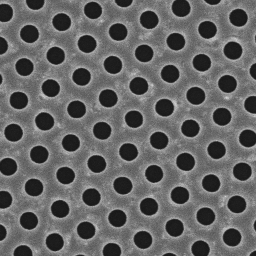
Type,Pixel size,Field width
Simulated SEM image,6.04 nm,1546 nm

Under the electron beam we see a regular array of holes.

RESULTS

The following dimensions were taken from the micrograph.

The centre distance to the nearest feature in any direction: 0.2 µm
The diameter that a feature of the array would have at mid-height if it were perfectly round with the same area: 111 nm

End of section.